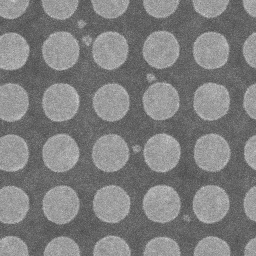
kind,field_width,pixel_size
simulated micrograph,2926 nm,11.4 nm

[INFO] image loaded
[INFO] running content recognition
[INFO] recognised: a regular array of raised bodies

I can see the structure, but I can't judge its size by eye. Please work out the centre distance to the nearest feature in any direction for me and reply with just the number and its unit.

569 nm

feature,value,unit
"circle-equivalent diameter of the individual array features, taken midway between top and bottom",0.417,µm